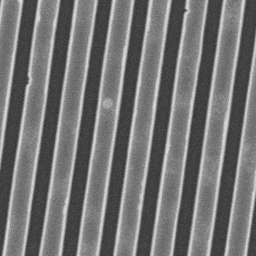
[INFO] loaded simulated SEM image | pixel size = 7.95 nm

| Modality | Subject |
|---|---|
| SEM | parallel lines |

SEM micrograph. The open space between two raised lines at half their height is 135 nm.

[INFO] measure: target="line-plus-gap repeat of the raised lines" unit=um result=0.292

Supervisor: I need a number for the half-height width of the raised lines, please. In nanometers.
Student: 157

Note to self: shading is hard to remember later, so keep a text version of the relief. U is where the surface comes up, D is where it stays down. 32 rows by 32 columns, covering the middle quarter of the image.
DUUUUUDDDDUUUUUDDDDUUUUUDDDDUUUU
DUUUUUDDDDUUUUUDDDDUUUUUDDDDUUUU
DUUUUDDDDDUUUUUDDDDUUUUUDDDDUUUU
UUUUUDDDDDUUUUUDDDDUUUUUDDDDUUUU
UUUUUDDDDUUUUUDDDDDUUUUDDDDDUUUU
UUUUUDDDDUUUUUDDDDDUUUUDDDDDUUUU
UUUUUDDDDUUUUUDDDDUUUUUDDDDDUUUU
UUUUUDDDDUUUUUDDDDUUUUUDDDDDUUUU
UUUUUDDDDUUUUUDDDDUUUUUDDDDUUUUU
UUUUDDDDDUUUUUDDDDUUUUUDDDDUUUUU
UUUUDDDDDUUUUUDDDDUUUUUDDDDUUUUU
UUUUDDDDDUUUUDDDDDUUUUUDDDDUUUUU
UUUUDDDDUUUUUDDDDDUUUUUDDDDUUUUU
UUUUDDDDUUUUUDDDDUUUUUDDDDDUUUUU
UUUUDDDDUUUUUDDDDUUUUUDDDDDUUUUD
UUUUDDDDUUUUUDDDDUUUUUDDDDUUUUUD
UUUDDDDDUUUUUDDDDUUUUUDDDDUUUUUD
UUUDDDDDUUUUUDDDDUUUUUDDDDUUUUUD
UUUDDDDDUUUUDDDDDUUUUUDDDDUUUUUD
UUUDDDDUUUUUDDDDDUUUUUDDDDUUUUUD
UUUDDDDUUUUUDDDDUUUUUDDDDDUUUUUD
UUUDDDDUUUUUDDDDUUUUUDDDDDUUUUUD
UUUDDDDUUUUUDDDDUUUUUDDDDUUUUUDD
UUDDDDDUUUUUDDDDUUUUUDDDDUUUUUDD
UUDDDDDUUUUUDDDDUUUUUDDDDUUUUUDD
UUDDDDDUUUUDDDDDUUUUUDDDDUUUUUDD
UUDDDDUUUUUDDDDDUUUUUDDDDUUUUUDD
UUDDDDUUUUUDDDDDUUUUDDDDDUUUUUDD
UUDDDDUUUUUDDDDDUUUUDDDDDUUUUUDD
UUDDDDUUUUUDDDDUUUUUDDDDUUUUUUDD
UDDDDDUUUUUDDDDUUUUUDDDDUUUUUDDD
UDDDDDUUUUUDDDDUUUUUDDDDUUUUUDDD